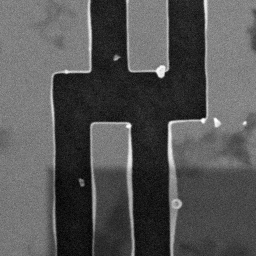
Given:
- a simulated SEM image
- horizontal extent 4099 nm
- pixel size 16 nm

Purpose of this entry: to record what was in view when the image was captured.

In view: groups of lines, slits or small figures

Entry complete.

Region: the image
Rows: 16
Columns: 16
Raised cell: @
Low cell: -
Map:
@@@@@@--@@---@@@
@@@@@@--@@@--@@@
@@@@@@--@@@--@@@
@@@@@@--@@@--@@@
@@@@@----@---@@@
@@@----------@@@
@@@----------@@@
@@@---------@@@@
@@@---@@---@@@@@
@@@---@@---@@@@@
@@@---@@---@@@@@
@@@---@@---@@@@@
@@@---@@---@@@@@
@@@---@@---@@@@@
@@@---@@---@@@@@
@@@@--@@---@@@@@